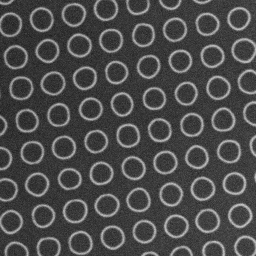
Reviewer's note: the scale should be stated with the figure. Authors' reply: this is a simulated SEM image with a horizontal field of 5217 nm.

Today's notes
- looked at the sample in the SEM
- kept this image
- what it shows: an array of small figures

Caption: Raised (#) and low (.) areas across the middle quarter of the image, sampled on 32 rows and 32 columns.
...........####...######...#####
....###...######..######...####.
...#####...#####...####.........
..######...#####.....#..........
...#####....##..................
...####......................###
.....................###....####
..............##....#####...####
............#####...#####...####
.....####...#####...#####....###
....#####...#####...#####.......
#...#####...#####...............
#...#####....###...............#
#....###......................##
#.....................####...###
..............####...#####...###
..............####...######..###
......####...######..######...##
#....######..######...####......
##...######...#####.............
###..######....##...............
###...####.....................#
##......................###....#
#...............##.....#####..##
...............#####..######...#
.......####....#####...#####....
###....#####...#####...####.....
####...#####...#####............
####...#####....###.............
####...####.....................
####.....................####...
.................###....#####...